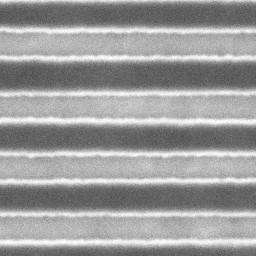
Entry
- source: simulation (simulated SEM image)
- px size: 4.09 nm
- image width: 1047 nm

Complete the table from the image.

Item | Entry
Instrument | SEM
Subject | lines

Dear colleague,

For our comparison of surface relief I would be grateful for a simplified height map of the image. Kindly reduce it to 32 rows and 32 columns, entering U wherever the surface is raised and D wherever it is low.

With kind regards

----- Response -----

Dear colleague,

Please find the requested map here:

UUUUUUUUUUUUUUUUUUUUUUUUUUUUUUUU
UUUUUUUUUUUUUUUUUUUUUUUUUUUUUUUU
UUUUUUUUUUUUUUUUUUUUUUUUUUUUUUUU
UUUUUUUUUUUUUUUUUUUUUUUUUUUUUUUU
DDDDDDDDDDDDDDDDDDDDDDDDDDDDDDDD
DDDDDDDDDDDDDDDDDDDDDDDDDDDDDDDD
DDDDDDDDDDDDDDDDDDDDDDDDDDDDDDDD
UUUUUUUUUUUUUUUUUUUUUUUUUUUUUUUU
UUUUUUUUUUUUUUUUUUUUUUUUUUUUUUUU
UUUUUUUUUUUUUUUUUUUUUUUUUUUUUUUU
UUUUUUUUUUUUUUUUUUUUUUUUUUUUUUUU
UUUUUUUUUUUUUUUUUUUUUUUUUUUUUUUU
DDDDDDDDDDDDDDDDDDDDDDDDDDDDDDDD
DDDDDDDDDDDDDDDDDDDDDDDDDDDDDDDD
DDDDDDDDDDDDDDDDDDDDDDDDDDDDDDDD
UUUUUUUUUUUUUUUUUUUUUUUUUUUUUUUU
UUUUUUUUUUUUUUUUUUUUUUUUUUUUUUUU
UUUUUUUUUUUUUUUUUUUUUUUUUUUUUUUU
UUUUUUUUUUUUUUUUUUUUUUUUUUUUUUUU
DDDDDDDDDDDDDDDDDDDDUDDDDDDDDDDD
DDDDDDDDDDDDDDDDDDDDDDDDDDDDDDDD
DDDDDDDDDDDDDDDDDDDDDDDDDDDDDDDD
DUDDDDUUUUDUUUUUUUUUUUUUUUUUUUUU
UUUUUUUUUUUUUUUUUUUUUUUUUUUUUUUU
UUUUUUUUUUUUUUUUUUUUUUUUUUUUUUUU
UUUUUUUUUUUUUUUUUUUUUUUUUUUUUUUU
UUUUUUUUUUUUUUUUUUUUUUUUUUUUUUUU
DDDDDDDDDDDDDDDDDDDDDDDDDDDDDDDD
DDDDDDDDDDDDDDDDDDDDDDDDDDDDDDDD
DDDDDDDDDDDDDDDDDDDDDDDDDDDDDDDD
UUUUUUUUUUUUUUUUUUUUUUUUUUUUUUUU
UUUUUUUUUUUUUUUUUUUUUUUUUUUUUUUU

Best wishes